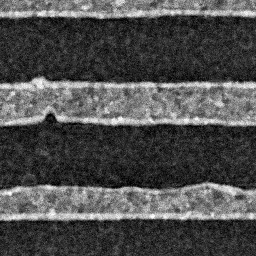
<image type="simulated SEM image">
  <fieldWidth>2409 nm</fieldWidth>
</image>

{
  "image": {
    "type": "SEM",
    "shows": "one or a few lines or trenches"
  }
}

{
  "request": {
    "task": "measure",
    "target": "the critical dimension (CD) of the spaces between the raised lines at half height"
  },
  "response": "70.7 px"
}